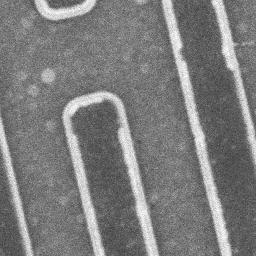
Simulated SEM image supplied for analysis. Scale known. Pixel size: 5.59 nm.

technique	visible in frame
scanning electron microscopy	one or a few lines or trenches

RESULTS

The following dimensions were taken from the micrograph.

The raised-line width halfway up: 314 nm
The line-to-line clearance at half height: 369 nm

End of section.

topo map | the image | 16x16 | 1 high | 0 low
0001100000111100
0000000000011100
0000000000011100
0000000000011110
0000000000011110
0000000000001110
0000011000001110
0000111100001111
0000111100001111
0000011100001111
1000011100000111
1000011110000111
1000011110000111
1000001110000111
1100001110000011
1100001111000011